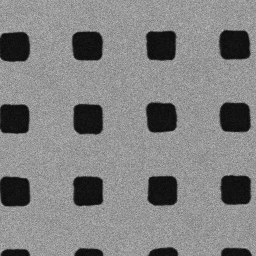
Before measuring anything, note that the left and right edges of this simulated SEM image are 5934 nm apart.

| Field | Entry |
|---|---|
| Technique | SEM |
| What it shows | a regular array of holes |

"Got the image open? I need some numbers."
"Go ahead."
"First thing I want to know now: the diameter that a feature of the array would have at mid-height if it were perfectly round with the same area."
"744 nanometres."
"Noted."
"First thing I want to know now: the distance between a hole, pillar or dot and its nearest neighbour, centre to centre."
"1680 nm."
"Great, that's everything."